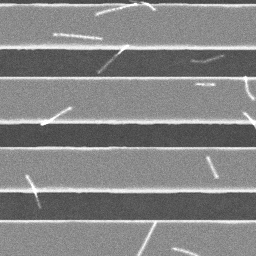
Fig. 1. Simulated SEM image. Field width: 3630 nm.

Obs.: lines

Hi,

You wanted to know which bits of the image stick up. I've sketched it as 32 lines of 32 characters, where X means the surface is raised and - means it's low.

-X--X--------XXXXXX-XXX---------
XXXXXXXXXXXXXXXXXXXXXXXXXXXXXXXX
XXXXXXXXXXXXXXXXXXXXXXXXXXXXXXXX
XXXXXXXXXXXXXXXXXXXXXXXXXXXXXXXX
XXXXXXXXXXXXXXXXXXXXXXXXXXXXXXXX
XXXXXXXXXXXXXXXXXXXXXXXXXXXXXXXX
--------------------------------
--------------------------------
--------------------------------
--------------------------------
XXXXXXXXXXXXXXXXXXXXXXXXXXXXXXXX
XXXXXXXXXXXXXXXXXXXXXXXXXXXXXXXX
XXXXXXXXXXXXXXXXXXXXXXXXXXXXXXXX
XXXXXXXXXXXXXXXXXXXXXXXXXXXXXXXX
XXXXXXXXXXXXXXXXXXXXXXXXXXXXXXXX
-----X-------------------------X
--------------------------------
--------------------------------
XXXXXXXXXXXXXXXXXXXXXXXXXXXXXXXX
XXXXXXXXXXXXXXXXXXXXXXXXXXXXXXXX
XXXXXXXXXXXXXXXXXXXXXXXXXXXXXXXX
XXXXXXXXXXXXXXXXXXXXXXXXXXXXXXXX
XXXXXXXXXXXXXXXXXXXXXXXXXXXXXXXX
XXXXXXXXXXXXXXXXXXXXXXXXXXXXXXXX
--------------------------------
--------------------------------
--------------------------------
--------------------------------
XXXXXXXXXXXXXXXXXXXXXXXXXXXXXXXX
XXXXXXXXXXXXXXXXXXXXXXXXXXXXXXXX
XXXXXXXXXXXXXXXXXXXXXXXXXXXXXXXX
XXXXXXXXXXXXXXXXXXXXXXXXXXXXXXXX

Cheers